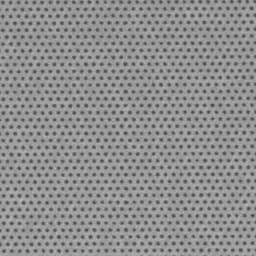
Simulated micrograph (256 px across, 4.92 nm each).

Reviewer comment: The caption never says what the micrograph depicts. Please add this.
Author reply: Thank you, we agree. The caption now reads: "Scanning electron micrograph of a regular array of holes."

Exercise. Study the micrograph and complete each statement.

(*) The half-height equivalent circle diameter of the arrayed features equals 19.2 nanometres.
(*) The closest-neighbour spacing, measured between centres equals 0.0376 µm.